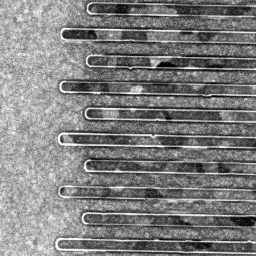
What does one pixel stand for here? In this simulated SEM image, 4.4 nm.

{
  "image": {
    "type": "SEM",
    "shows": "parallel lines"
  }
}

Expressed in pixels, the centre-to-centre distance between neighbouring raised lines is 26.2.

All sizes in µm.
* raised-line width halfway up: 0.0478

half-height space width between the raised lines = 65.4 nanometres